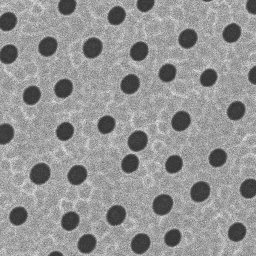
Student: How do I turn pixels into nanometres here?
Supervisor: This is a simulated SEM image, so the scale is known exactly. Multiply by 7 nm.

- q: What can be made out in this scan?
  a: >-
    a regular array of holes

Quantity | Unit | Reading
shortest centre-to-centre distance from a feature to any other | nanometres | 266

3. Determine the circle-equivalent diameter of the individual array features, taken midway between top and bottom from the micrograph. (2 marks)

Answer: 0.127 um